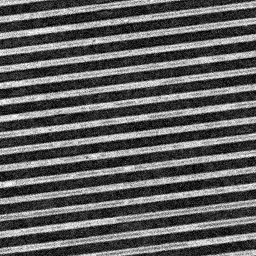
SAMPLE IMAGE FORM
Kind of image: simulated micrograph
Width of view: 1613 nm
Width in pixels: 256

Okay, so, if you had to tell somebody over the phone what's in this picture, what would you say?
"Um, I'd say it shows parallel lines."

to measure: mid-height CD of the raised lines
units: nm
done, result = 27.3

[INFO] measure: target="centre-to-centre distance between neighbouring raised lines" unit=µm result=0.103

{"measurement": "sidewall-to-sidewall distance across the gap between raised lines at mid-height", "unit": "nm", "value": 75.8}